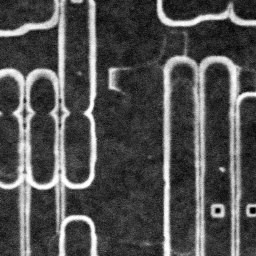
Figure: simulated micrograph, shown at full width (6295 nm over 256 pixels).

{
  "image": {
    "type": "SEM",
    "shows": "wiring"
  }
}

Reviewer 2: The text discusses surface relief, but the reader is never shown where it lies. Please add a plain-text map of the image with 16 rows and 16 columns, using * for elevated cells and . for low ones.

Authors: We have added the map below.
******....******
***.**..........
....**..........
....**..........
....**.....****.
******....*****.
******....******
******....******
******....******
******....******
******....******
*.*.*.....******
..........******
..........******
....**....******
....**....******